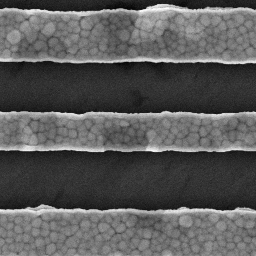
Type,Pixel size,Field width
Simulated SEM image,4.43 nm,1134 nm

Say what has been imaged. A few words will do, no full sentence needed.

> lines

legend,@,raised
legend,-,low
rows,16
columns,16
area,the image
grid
----------------
@@@@@@@@@@@@@@@@
@@@@@@@@@@@@@@@@
@@@@@@@@@@@@@@@@
----------------
----------------
----------------
@@@@@@@@@@@@@@@@
@@@@@@@@@@@@@@@@
----------------
----------------
----------------
----------------
@@@@@@@@@@@@@@@@
@@@@@@@@@@@@@@@@
@@@@@@@@@@@@@@@@